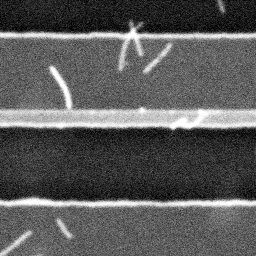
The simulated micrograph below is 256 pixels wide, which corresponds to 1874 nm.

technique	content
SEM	lines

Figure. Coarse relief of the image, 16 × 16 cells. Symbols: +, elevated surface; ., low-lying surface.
................
................
++++++++++++++++
++++++++++++++++
++++++++++++++++
++++++++++++++++
++++++++++++++++
++++++++++++++++
................
................
................
................
................
++++++++++++++++
++++++++++++++++
++++++++++++++++